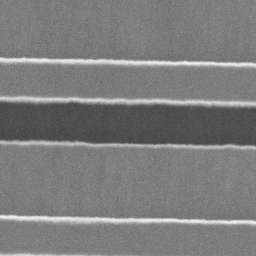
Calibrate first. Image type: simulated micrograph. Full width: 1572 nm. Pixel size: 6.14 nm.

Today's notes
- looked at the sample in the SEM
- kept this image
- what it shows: lines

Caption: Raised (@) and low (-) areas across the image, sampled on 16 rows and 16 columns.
@@@@@@@@@@@@@@@@
@@@@@@@@@@@@@@@@
@@@@@@@@@@@@@@@@
@@@@@@@@@@@@@@@@
@@@@@@@@@@@@@@@@
@@@@@@@@@@@@@@@@
--------------@@
----------------
----------------
@@@@@@@@@@@@@@@@
@@@@@@@@@@@@@@@@
@@@@@@@@@@@@@@@@
@@@@@@@@@@@@@@@@
@@@@@@@@@@@@@@@@
@@@@@@@@@@@@@@@@
@@@@@@@@@@@@@@@@